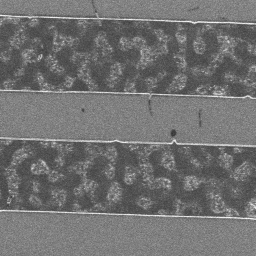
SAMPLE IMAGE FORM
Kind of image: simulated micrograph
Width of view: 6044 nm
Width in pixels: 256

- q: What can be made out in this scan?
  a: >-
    one or a few lines or trenches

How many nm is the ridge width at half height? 1740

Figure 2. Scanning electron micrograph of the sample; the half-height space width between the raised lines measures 1150 nm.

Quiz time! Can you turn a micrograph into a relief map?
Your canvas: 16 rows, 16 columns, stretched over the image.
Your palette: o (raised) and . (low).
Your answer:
................
oooooooooooooooo
oooooooooooooooo
oooooooooooooooo
oooooooooooooooo
oooooooooooooooo
................
................
................
oooooooooooooooo
oooooooooooooooo
oooooooooooooooo
oooooooooooooooo
...........ooooo
................
................